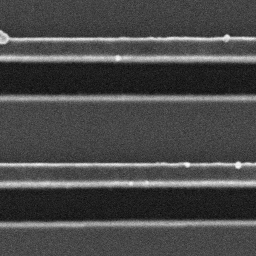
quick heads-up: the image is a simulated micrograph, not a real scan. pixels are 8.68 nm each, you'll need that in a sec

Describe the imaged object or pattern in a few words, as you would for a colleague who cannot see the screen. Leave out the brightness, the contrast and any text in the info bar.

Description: lines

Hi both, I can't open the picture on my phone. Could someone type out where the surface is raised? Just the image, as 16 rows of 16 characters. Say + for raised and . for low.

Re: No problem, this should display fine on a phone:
++++++++++++++++
++++++++++++++++
++++++++++++++++
++++++++++++++++
................
................
++++++++++++++++
++++++++++++++++
++++++++++++++++
++++++++++++++++
++++++++++++++++
++++++..++......
................
................
++++++++++++++++
++++++++++++++++